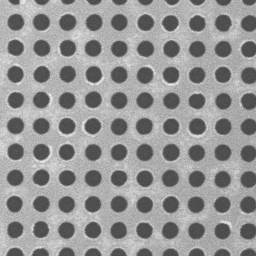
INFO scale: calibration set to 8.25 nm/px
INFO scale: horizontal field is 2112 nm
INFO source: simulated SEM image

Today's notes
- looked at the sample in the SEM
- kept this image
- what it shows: a regular array of holes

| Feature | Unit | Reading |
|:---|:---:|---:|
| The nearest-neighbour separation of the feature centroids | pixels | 25.6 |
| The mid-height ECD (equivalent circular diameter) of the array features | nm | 139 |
